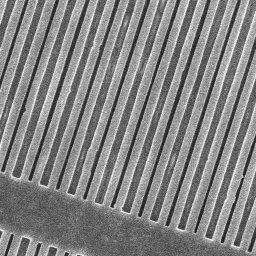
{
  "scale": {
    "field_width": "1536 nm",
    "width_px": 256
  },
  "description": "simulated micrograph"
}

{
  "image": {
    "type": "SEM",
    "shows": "parallel lines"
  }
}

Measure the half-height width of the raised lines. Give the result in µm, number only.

0.0485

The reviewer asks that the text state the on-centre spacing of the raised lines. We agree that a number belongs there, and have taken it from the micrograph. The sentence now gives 86.3 nm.